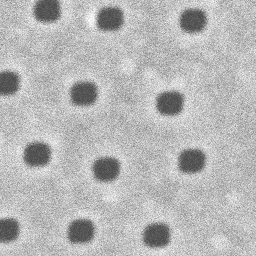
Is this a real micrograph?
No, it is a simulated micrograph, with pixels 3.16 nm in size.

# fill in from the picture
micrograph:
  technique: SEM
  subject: a regular array of holes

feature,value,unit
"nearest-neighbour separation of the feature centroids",0.223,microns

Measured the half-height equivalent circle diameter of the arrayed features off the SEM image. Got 89.7 nanometers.